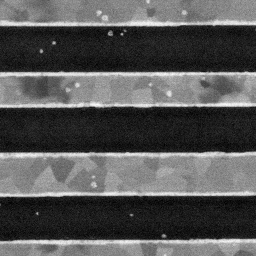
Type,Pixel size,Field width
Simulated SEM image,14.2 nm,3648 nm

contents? lines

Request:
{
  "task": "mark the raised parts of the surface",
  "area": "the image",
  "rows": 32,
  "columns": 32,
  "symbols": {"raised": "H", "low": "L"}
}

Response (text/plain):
HHHHHHHHHHHHHHHHHHHHHHHHHHHHHHHH
HHHHHHHHHHHHHHHHHHHHHHHHHHHHHHHH
HHHHHHHHHHHHHHHHHHHHHHHHHHHHHHHH
LLLLLLLLLLLLLLLLLLLLLLLLLLLLLLLL
LLLLLLLLLLLLLLLLLLLLLLLLLLLLLLLL
LLLLLLLLLLLLLLLLLLLLLLLLLLLLLLLL
LLLLLLLLLLLLLLLLLLLLLLLLLLLLLLLL
LLLLLLLLLLLLLLLLLLLLLLLLLLLLLLLL
LLLLLLLLLLLLLLLLLLLLLLLLLLLLLLLL
HHHHHHHHHHHHHHHHHHHHHHHHHHHHHHHH
HHHHHHHHHHHHHHHHHHHHHHHHHHHHHHHH
HHHHHHHHHHHHHHHHHHHHHHHHHHHHHHHH
HHHHHHHHHHHHHHHHHHHHHHHHHHHHHHHH
LLLLLLLLLLLLLLLLLLLLLLLLLLLLLLLL
LLLLLLLLLLLLLLLLLLLLLLLLLLLLLLLL
LLLLLLLLLLLLLLLLLLLLLLLLLLLLLLLL
LLLLLLLLLLLLLLLLLLLLLLLLLLLLLLLL
LLLLLLLLLLLLLLLLLLLLLLLLLLLLLLLL
LLLLLLLLLLLLLLLLLLLLLLLLLLLLLLLL
HHHHHHHHHHHHHHHHHHHHHHHHHHHHHHHH
HHHHHHHHHHHHHHHHHHHHHHHHHHHHHHHH
HHHHHHHHHHHHHHHHHHHHHHHHHHHHHHHH
HHHHHHHHHHHHHHHHHHHHHHHHHHHHHHHH
HHHHHHHHHHHHHHHHHHHHHHHHHHHHHHHH
LLLLLLLLLLLLLLLLLLLLLLLLLLLLLLLL
LLLLLLLLLLLLLLLLLLLLLLLLLLLLLLLL
LLLLLLLLLLLLLLLLLLLLLLLLLLLLLLLL
LLLLLLLLLLLLLLLLLLLLLLLLLLLLLLLL
LLLLLLLLLLLLLLLLLLLLLLLLLLLLLLLL
LLLLLLLLLLLLLLLLLLLLLLLLLLLLLLLL
HHHHHHHHHHHHHHHHHHHHHHHHHHHHHHHH
HHHHHHHHHHHHHHHHHHHHHHHHHHHHHHHH